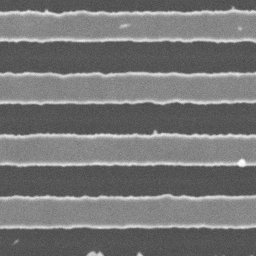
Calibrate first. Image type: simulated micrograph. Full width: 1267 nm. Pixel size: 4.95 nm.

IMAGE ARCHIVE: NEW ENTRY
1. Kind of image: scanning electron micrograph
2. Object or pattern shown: lines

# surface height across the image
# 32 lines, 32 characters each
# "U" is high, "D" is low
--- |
DDDDDDDDDDDDDDDDDDDDDDDDDDDDDDDD
DUUUUDDDUUUDUDDUDDUUUUDDUUUUUUUU
UUUUUUUUUUUUUUUUUUUUUUUUUUUUUUUU
UUUUUUUUUUUUUUUUUUUUUUUUUUUUUUUU
UUUUUUUUUUUUUUUUUUUUUUUUUUUUUUUU
DDDDDDDDDDDDDDDDDDDDDDDDDDDDDDDD
DDDDDDDDDDDDDDDDDDDDDDDDDDDDDDDD
DDDDDDDDDDDDDDDDDDDDDDDDDDDDDDDD
DDDDDDDDDDDDDDDDDDDDDDDDDDDDDDDD
UUUUUUUUUUUUUUUUUUUUUUUUUUUUUUUU
UUUUUUUUUUUUUUUUUUUUUUUUUUUUUUUU
UUUUUUUUUUUUUUUUUUUUUUUUUUUUUUUU
UUUUUUUUUUUUUUUUUUUUUUUUUUUUUUUU
DDDDDDDDDDDDDDDDDDDDDDDDDDDDDDDD
DDDDDDDDDDDDDDDDDDDDDDDDDDDDDDDD
DDDDDDDDDDDDDDDDDDDDDDDDDDDDDDDD
DDDDDDDDDDDDDDDDDDDDDDDDDDDDDDDD
UUUUUUUUUUUUUUUUUUUUUUUUUUUUUUUU
UUUUUUUUUUUUUUUUUUUUUUUUUUUUUUUU
UUUUUUUUUUUUUUUUUUUUUUUUUUUUUUUU
UUUUUUUUUUUUUUUUUUUUUUUUUUUUUUUU
DDDDDDDDDDDDDDDDDDDDDDDDDDDDDDDD
DDDDDDDDDDDDDDDDDDDDDDDDDDDDDDDD
DDDDDDDDDDDDDDDDDDDDDDDDDDDDDDDD
DDDDDDDDDDDDDDDDDDDDUUDDDDDUDDDU
UUUUUUUUUUUUUUUUUUUUUUUUUUUUUUUU
UUUUUUUUUUUUUUUUUUUUUUUUUUUUUUUU
UUUUUUUUUUUUUUUUUUUUUUUUUUUUUUUU
UUUUUUUUUDDUUUUUDDUDDDDDDDUDUUUD
DDDDDDDDDDDDDDDDDDDDDDDDDDDDDDDD
DDDDDDDDDDDDDDDDDDDDDDDDDDDDDDDD
DDDDDDDDDDDDDDDDDDDDDDDDDDDDDDDD